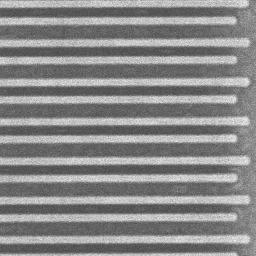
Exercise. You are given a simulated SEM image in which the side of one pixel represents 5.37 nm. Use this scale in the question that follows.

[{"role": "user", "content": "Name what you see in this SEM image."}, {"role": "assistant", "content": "parallel lines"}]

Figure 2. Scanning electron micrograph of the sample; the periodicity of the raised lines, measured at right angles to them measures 107 nm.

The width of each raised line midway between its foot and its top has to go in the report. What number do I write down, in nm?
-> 41.6